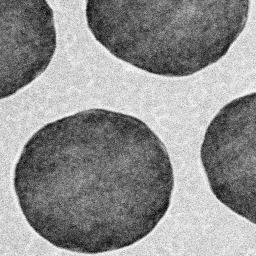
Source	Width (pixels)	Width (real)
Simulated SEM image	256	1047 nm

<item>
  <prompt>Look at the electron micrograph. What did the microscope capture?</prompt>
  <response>holes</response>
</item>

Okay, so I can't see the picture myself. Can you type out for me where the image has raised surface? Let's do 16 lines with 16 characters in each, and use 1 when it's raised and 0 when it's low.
0001100000000000
0001100000000001
0000110000000001
0001111000000011
0001111110001111
0111111111111111
1111111111111100
1111000001111000
1100000000111000
1000000000111000
1000000000011000
1000000000011000
1000000000011100
1100000000111110
1100000001111111
1111000011111111